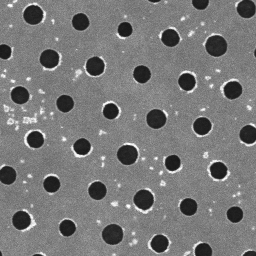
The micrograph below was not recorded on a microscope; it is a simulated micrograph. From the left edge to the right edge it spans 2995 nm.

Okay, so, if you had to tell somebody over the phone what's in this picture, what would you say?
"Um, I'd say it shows a regular array of holes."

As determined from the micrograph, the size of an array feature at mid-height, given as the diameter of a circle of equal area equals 211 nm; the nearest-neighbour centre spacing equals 539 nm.